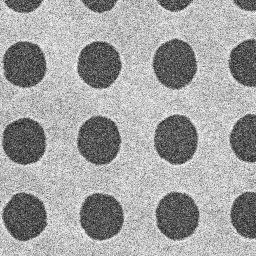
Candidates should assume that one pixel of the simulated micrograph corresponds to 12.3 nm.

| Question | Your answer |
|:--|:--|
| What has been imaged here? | a regular array of holes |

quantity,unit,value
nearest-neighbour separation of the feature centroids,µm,0.925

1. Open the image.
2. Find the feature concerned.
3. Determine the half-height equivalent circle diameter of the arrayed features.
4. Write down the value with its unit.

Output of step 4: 0.572 µm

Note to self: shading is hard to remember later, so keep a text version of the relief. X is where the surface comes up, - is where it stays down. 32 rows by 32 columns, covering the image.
X----XXXXX----XXXXXX----XXXXX---
XX--XXXXXXXX-XXXXXXXX-XXXXXXXXXX
XXXXXXXXXXXXXXXXXXXXXXXXXXXXXXXX
XXXXXXXXXXXXXXXXXXXXXXXXXXXXXXXX
XXXXXXXXXXXXXXXXXXXXXXXXXXXXXXXX
XX--XXXXXXX---XXXXXX----XXXXXX--
X----XXXXX-----XXXX-----XXXXX---
------XXXX-----XXXX-----XXXXX---
------XXXX-----XXXX------XXXX---
X-----XXXX-----XXXX-----XXXXX---
XX---XXXXXX---XXXXXX----XXXXXX--
XXXXXXXXXXXXXXXXXXXXXXXXXXXXXXXX
XXXXXXXXXXXXXXXXXXXXXXXXXXXXXXXX
XXXXXXXXXXXXXXXXXXXXXXXXXXXXXXXX
XXXXXXXXXXXX-XXXXXXXX--XXXXXXX--
X----XXXXX-----XXXXX----XXXXX---
------XXXX-----XXXX------XXXX---
------XXXX-----XXXX------XXXX---
------XXXX-----XXXX------XXXX---
X----XXXXX-----XXXXX----XXXXX---
XX--XXXXXXXX--XXXXXXXX-XXXXXXXXX
XXXXXXXXXXXXXXXXXXXXXXXXXXXXXXXX
XXXXXXXXXXXXXXXXXXXXXXXXXXXXXXXX
XXXXXXXXXXXXXXXXXXXXXXXXXXXXXXXX
XX--XXXXXXX---XXXXXXX---XXXXXX--
X----XXXXX-----XXXXX-----XXXX---
------XXXX-----XXXX------XXXX---
------XXXX------XXXX-----XXXX---
X-----XXXX-----XXXXX-----XXXX---
X----XXXXXX---XXXXXXX---XXXXXX--
XXXXXXXXXXXXXXXXXXXXXXXXXXXXXXXX
XXXXXXXXXXXXXXXXXXXXXXXXXXXXXXXX